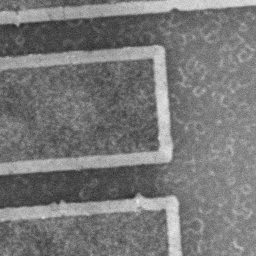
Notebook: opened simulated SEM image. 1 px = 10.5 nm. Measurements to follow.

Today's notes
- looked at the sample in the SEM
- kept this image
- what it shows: one or a few lines or trenches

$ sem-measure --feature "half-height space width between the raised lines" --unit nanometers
472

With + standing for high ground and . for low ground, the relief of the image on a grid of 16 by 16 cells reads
+++++++++.......
................
................
.......+++......
++++++++++......
++++++++++......
++++++++++......
++++++++++......
++++++++++......
++++++++++......
+...............
................
................
+++++++++++.....
+++++++++++.....
+++++++++++.....